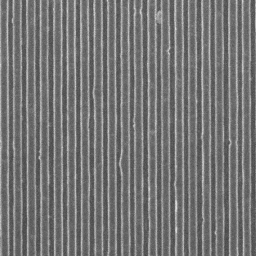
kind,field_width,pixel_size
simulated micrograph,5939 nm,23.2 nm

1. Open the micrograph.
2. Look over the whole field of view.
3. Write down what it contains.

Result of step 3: parallel lines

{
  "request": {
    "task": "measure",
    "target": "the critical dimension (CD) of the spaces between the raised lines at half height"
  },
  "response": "0.116 µm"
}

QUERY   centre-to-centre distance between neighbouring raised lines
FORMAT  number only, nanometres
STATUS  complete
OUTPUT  312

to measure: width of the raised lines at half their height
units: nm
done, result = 186